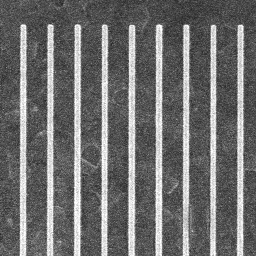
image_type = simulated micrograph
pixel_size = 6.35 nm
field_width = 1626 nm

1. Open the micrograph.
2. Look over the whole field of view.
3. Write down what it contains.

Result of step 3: parallel lines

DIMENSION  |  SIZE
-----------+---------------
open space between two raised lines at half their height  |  139 nm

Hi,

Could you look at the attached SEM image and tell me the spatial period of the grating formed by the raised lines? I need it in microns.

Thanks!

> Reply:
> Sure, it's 0.172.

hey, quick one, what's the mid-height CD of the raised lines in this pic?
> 0.0326 micrometres